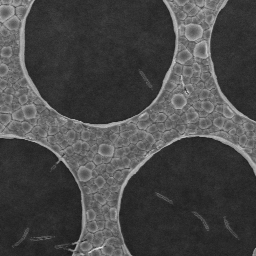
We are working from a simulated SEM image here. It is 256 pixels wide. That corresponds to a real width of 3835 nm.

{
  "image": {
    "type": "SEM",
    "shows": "holes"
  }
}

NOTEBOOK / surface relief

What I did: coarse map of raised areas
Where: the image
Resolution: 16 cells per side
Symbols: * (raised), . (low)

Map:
**.........***..
*..........**...
*..........**...
*..........**...
**.........**...
**........****..
***......*****..
*****...********
****************
...*******.....*
....*****.......
.....***........
.....***........
.....**.........
.....***........
.....***........